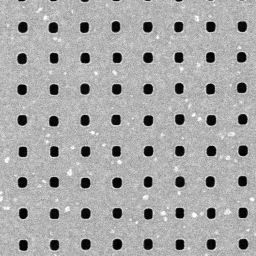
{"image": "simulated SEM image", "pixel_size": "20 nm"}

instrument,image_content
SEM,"a regular array of holes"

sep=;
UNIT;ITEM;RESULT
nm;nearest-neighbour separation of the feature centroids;614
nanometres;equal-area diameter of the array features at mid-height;220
